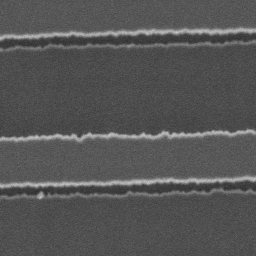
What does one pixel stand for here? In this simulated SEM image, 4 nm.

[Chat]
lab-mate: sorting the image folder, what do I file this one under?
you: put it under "lines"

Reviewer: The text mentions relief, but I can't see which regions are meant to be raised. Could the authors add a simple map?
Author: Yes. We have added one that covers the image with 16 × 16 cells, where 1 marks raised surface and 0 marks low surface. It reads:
1111111111111111
1111111111111111
0000000000000000
0000000000000000
0000000000000000
0000000000000000
0000000000000000
0000000000000000
0011111111111111
1111111111111111
1111111111111111
1111111000000000
0000000000000000
0000000000000000
0000000000000000
0000000000000000